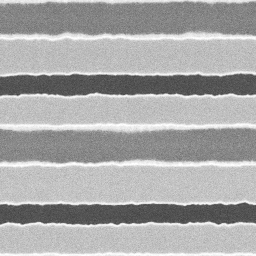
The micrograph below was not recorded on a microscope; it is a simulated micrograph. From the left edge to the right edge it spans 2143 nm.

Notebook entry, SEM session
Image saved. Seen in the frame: lines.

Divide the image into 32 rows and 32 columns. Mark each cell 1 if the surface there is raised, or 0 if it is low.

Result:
00000000000000000000000000000000
00000000000000000000000000000000
00000000000000000000000000000000
00000000000000000000000000000000
00000000000000000000000000000000
11111111111111111111111111111111
11111111111111111111111111111111
11111111111111111111111111111111
11111111111111111111111111111111
00000000000000000000000000000000
00000000000000000000000000000000
00000000000000000000000000000000
11111111111111111111111111111111
11111111111111111111111111111111
11111111111111111111111111111111
11111111111111111111111111111111
00000000000000000000000000000000
00000000000000000000000000000000
00000000000000000000000000000000
00000000000000000000000000000000
00000000110001101100000000100000
11111111111111111111111111111111
11111111111111111111111111111111
11111111111111111111111111111111
11111111111111111111111111111111
01101100110111111100001111101001
00000000000000000000000000000000
00000000000000000000000000000000
11111111111111111111111111111111
11111111111111111111111111111111
11111111111111111111111111111111
11111111111111111111111111111111